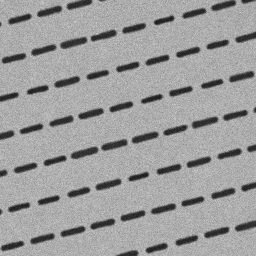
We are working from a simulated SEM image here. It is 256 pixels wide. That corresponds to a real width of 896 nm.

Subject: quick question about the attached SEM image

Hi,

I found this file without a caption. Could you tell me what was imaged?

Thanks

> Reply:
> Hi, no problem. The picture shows a regular array of holes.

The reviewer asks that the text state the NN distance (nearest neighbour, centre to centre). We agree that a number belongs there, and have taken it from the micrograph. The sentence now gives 30.8 pixels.